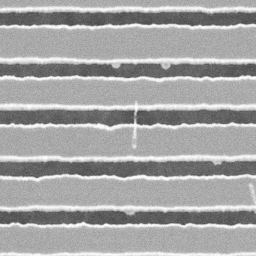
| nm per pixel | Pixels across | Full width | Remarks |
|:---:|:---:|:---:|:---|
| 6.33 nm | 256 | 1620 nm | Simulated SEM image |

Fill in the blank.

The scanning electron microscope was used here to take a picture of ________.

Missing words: lines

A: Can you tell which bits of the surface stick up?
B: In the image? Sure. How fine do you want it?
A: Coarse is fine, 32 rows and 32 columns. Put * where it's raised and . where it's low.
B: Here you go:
********************************
................................
................................
********************************
********************************
********************************
********************************
********************************
................................
................................
********************************
********************************
********************************
..........****.****..........*..
................................
....*.*...**....*..*....***.****
********************************
********************************
********************************
********************************
................................
................................
********************************
********************************
********************************
********************************
................................
................................
********************************
********************************
********************************
********************************